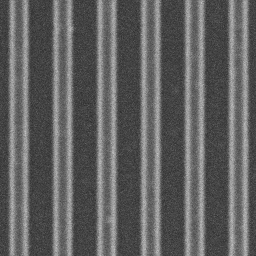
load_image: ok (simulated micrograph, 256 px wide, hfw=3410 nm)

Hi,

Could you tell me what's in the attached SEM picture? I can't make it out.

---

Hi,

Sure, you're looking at parallel lines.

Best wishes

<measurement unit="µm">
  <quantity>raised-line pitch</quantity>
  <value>0.585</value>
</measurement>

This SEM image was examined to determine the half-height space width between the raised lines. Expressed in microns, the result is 0.376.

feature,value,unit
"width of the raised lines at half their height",213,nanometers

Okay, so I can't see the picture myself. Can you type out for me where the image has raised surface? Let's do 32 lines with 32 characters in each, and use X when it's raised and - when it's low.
-XX----XX---XX----XX---XX----XX-
-XX----XX---XX----XX---XX----XX-
-XX----XX---XX----XX---XX----XX-
-XX----XX---XX----XX---XX----XX-
-XX----XX---XX----XX---XX----XX-
-XX----XX---XX----XX---XX----XX-
-XX----XX---XX----XX---XX----XX-
-XX----XX---XX----XX---XX----XX-
-XX----XX---XX----XX---XX----XX-
-XX----XX---XX----XX---XX----XX-
-XX----XX---XX----XX---XX----XX-
-XX----XX---XX----XX---XX----XX-
-XX----XX---XX----XX---XX----XX-
-XX----XX---XX----XX---XX----XX-
-XX----XX---XX----XX---XX----XX-
-XX----XX---XX----XX---XX----XX-
-XX----XX---XX----XX---XX----XX-
-XX----XX---XX----XX---XX----XX-
-XX----XX---XX----XX---XX----XX-
-XX----XX---XX----XX---XX----XX-
-XX----XX---XX----XX---XX----XX-
-XX----XX---XX----XX---XX----XX-
-XX----XX---XX----XX---XX----XX-
-XX----XX---XX----XX---XX----XX-
-XX----XX---XX----XX---XX----XX-
-XX----XX---XX----XX---XX----XX-
-XX----XX---XX----XX---XX----XX-
-XX----XX---XX----XX---XX----XX-
-XX----XX---XX----XX---XX----XX-
-XX----XX---XX----XX---XX----XX-
-XX----XX---XX----XX---XX----XX-
-XX----XX---XX----XX---XX----XX-